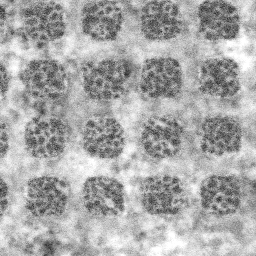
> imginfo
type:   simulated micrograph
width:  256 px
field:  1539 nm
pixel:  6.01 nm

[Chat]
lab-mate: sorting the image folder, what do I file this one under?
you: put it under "a regular array of raised bodies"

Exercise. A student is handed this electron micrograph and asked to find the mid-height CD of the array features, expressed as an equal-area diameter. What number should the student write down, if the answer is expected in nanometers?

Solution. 263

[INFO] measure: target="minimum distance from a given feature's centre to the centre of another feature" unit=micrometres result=0.346